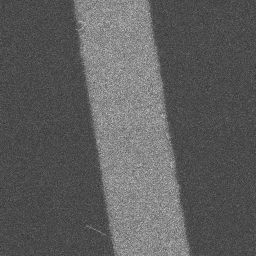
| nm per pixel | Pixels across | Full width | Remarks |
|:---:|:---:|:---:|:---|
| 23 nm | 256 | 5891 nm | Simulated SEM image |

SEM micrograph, one or a few lines or trenches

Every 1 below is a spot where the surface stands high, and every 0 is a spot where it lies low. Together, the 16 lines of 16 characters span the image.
1111100001111111
1111100001111111
1111100000111111
1111100000111111
1111100000111111
1111110000111111
1111110000111111
1111110000111111
1111110000011111
1111110000011111
1111110000011111
1111110000011111
1111111000011111
1111111000011111
1111111000001111
1111111000001111